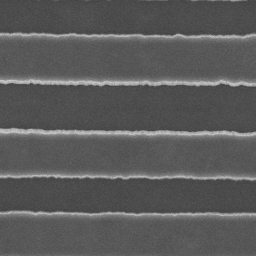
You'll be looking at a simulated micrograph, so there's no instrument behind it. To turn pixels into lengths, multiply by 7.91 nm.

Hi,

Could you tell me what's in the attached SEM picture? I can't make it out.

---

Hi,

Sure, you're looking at lines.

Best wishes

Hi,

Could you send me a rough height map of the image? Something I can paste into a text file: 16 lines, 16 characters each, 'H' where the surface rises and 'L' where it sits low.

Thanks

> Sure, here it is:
LLLLLLLLLLLLLLLL
LLLLLLLLLLLLLLLL
HHHHHHHHHHHHHHHH
HHHHHHHHHHHHHHHH
HHHHHHHHHHHHHHHH
LLLLLLLLLLLLLLLL
LLLLLLLLLLLLLLLL
LLLLLLLLLLLLLLLL
HHHHHHHHHHHHHHHH
HHHHHHHHHHHHHHHH
HHHHHHHHHHHHHHHH
LLLLLLLLLLLLLLLL
LLLLLLLLLLLLLLLL
HHHHHHHHHHHHHHHH
HHHHHHHHHHHHHHHH
HHHHHHHHHHHHHHHH